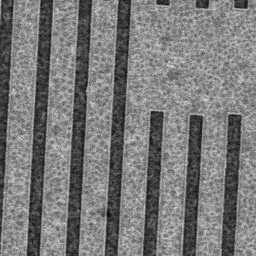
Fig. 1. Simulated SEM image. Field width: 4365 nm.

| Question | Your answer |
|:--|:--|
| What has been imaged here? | parallel lines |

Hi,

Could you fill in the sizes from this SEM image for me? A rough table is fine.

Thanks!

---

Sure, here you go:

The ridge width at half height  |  0.428 microns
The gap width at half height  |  236 nm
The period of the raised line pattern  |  664 nanometres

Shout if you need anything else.